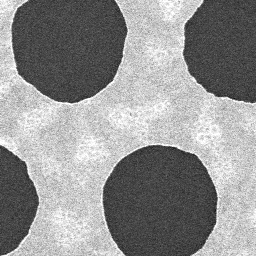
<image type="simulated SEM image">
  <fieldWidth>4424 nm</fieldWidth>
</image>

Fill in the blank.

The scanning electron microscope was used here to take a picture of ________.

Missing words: holes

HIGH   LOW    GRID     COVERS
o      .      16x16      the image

o......ooooo....
o.......oooo....
o.......ooo.....
o.......ooo.....
o......ooooo....
oo.....oooooo...
oooooooooooooooo
oooooooooooooooo
oooooooooooooooo
.ooooooo....oooo
..ooooo......ooo
..ooooo......ooo
..oooo........oo
..ooooo.......oo
..ooooo......ooo
.oooooo......ooo